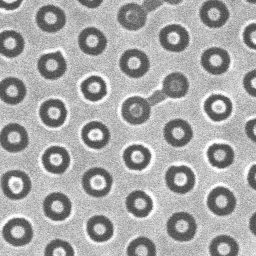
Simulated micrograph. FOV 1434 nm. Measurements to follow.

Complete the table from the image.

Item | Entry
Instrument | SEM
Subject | a regular array of ring-shaped grooves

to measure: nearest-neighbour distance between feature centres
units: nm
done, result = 261